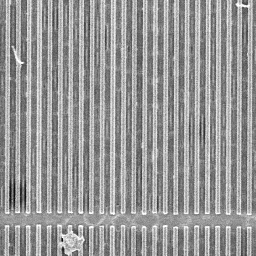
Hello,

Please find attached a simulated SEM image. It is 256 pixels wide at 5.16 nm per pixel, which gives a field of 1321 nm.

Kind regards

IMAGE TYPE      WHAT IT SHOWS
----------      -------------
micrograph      parallel lines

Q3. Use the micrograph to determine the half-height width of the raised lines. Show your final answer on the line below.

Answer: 18.7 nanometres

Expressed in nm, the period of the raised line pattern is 54.3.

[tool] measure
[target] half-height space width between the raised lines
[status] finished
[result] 32.9 nm